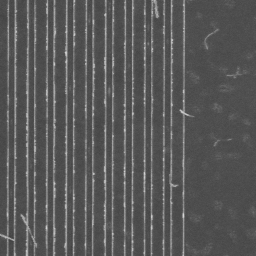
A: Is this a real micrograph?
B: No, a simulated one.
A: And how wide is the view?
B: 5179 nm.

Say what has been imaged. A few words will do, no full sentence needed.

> parallel lines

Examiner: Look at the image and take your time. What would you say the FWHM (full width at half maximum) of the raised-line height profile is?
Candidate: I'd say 0.268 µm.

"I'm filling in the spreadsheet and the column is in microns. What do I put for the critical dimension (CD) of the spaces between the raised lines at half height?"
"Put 0.119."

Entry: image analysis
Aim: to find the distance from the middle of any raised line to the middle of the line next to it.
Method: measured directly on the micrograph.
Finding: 0.395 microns